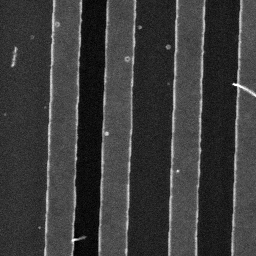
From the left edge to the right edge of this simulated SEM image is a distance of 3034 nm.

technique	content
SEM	lines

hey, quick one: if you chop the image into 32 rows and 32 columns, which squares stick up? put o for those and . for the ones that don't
.......ooo...oooo.....oooo....oo
.......ooo...oooo.....oooo....oo
.......ooo...oooo.....oooo....oo
.......ooo...oooo.....oooo....oo
.......ooo...oooo.....ooo.....oo
.......ooo...oooo.....ooo.....oo
......oooo...oooo.....ooo.....oo
......oooo...oooo.....ooo.....oo
......oooo...oooo.....ooo.....oo
......oooo...oooo.....ooo.....oo
......oooo...oooo.....ooo....ooo
......oooo...ooo......ooo.....oo
......oooo...ooo......ooo.....oo
......oooo...ooo......ooo.....oo
......oooo...ooo......ooo.....oo
......oooo...ooo......ooo....ooo
......oooo...ooo......ooo....ooo
......oooo...ooo.....oooo....ooo
......oooo...ooo.....oooo....ooo
......oooo...ooo.....oooo....ooo
......oooo...ooo.....oooo....ooo
......ooo....ooo.....oooo....ooo
......ooo....ooo.....oooo....ooo
......ooo....ooo.....oooo....ooo
......ooo....ooo.....oooo....ooo
......ooo....ooo.....oooo....ooo
......ooo....ooo.....oooo....ooo
......ooo....ooo.....oooo....ooo
......ooo...oooo.....oooo....ooo
......ooo...oooo.....oooo....ooo
......ooo...oooo.....oooo....ooo
......ooo...oooo.....oooo....ooo